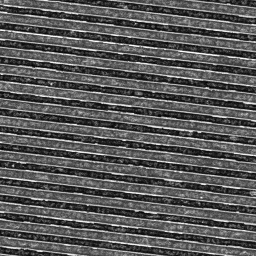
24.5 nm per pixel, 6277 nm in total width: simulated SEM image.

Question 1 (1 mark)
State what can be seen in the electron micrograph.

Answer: parallel lines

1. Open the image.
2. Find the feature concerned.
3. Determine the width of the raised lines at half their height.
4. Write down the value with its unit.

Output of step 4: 0.186 um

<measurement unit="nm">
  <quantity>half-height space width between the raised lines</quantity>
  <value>225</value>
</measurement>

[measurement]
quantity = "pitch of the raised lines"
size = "420 nanometres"